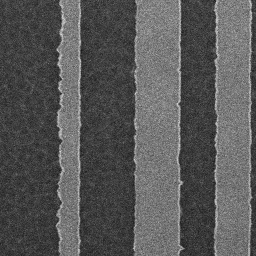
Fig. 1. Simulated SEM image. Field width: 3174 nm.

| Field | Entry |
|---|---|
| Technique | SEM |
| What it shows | one or a few lines or trenches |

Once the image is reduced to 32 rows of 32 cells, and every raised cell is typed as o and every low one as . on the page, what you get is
........oo.......ooooo.....oooo.
........oo.......ooooo.....oooo.
........oo.......ooooo.....oooo.
........oo.......ooooo.....oooo.
........oo.......ooooo.....oooo.
........oo.......ooooo.....oooo.
.......ooo.......ooooo.....oooo.
.......ooo.......ooooo.....oooo.
........oo.......ooooo.....oooo.
........oo.......ooooo.....oooo.
.......ooo.......ooooo.....oooo.
........oo.......ooooo.....oooo.
........oo.......ooooo.....oooo.
........oo.......ooooo.....oooo.
.......ooo.......ooooo.....oooo.
.......ooo.......ooooo.....oooo.
........oo.......ooooo.....oooo.
........oo.......ooooo.....oooo.
........oo.......ooooo.....oooo.
........oo.......ooooo.....oooo.
........oo.......ooooo.....oooo.
........oo.......ooooo.....oooo.
.......ooo.......oooooo....oooo.
.......ooo.......ooooo.....oooo.
.......ooo.......ooooo.....oooo.
........oo.......ooooo.....oooo.
.......ooo.......ooooo.....oooo.
.......ooo.......ooooo.....oooo.
.......ooo.......ooooo.....oooo.
........oo.......ooooo.....oooo.
.......ooo.......ooooo.....oooo.
.......ooo.......ooooo.....oooo.